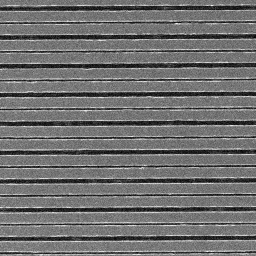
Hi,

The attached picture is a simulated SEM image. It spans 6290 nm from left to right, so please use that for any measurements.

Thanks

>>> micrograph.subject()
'parallel lines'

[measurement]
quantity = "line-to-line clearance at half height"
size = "64.5 nm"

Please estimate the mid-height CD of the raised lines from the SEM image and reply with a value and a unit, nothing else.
264 nm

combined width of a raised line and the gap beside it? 0.354 micrometres